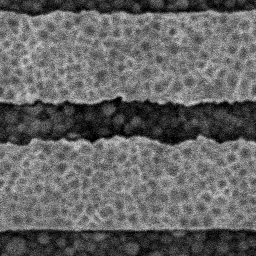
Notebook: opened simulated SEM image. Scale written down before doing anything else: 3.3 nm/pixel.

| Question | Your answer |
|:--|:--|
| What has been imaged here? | one or a few lines or trenches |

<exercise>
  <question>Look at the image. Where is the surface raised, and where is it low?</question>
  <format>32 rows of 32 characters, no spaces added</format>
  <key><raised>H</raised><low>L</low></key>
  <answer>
LLLLLLLLLLLLLLLLLLLLLLLLLLLLLLLL
LLLLLLLLLLLHLLLLLLLLLLLLLLHLLLHH
HHHHHHHHHHHHHHHHHHHHHHHHHHHHHHHH
HHHHHHHHHHHHHHHHHHHHHHHHHHHHHHHH
HHHHHHHHHHHHHHHHHHHHHHHHHHHHHHHH
HHHHHHHHHHHHHHHHHHHHHHHHHHHHHHHH
HHHHHHHHHHHHHHHHHHHHHHHHHHHHHHHH
HHHHHHHHHHHHHHHHHHHHHHHHHHHHHHHH
HHHHHHHHHHHHHHHHHHHHHHHHHHHHHHHH
HHHHHHHHHHHHHHHHHHHHHHHHHHHHHHHH
HHHHHHHHHHHHHHHHHHHHHHHHHHHHHHHH
HHHHHHHHHHHHHHHHHHHHHHHHHHHHHHHH
HHHHHHHHHHHHLLLLHHLHHHHHHHHHHHHL
LLLLLLLLLLLLLLLLLLLLLLLLLLLLLLLL
LLLLLLLLLLLLLLLLLLLLLLLLLLLLLLLL
LLLLLLLLLLLLLLLLLLLLLLLLLLLLLLLL
LLLLLLLLLLLLLLLLLLLLLLLLLLLLLLLL
LLLLHLLLLLLLLHHHHHHLLLLLHHLLLLHL
HHHHHHHHHHHHHHHHHHHHHHHHHHHHHHHH
HHHHHHHHHHHHHHHHHHHHHHHHHHHHHHHH
HHHHHHHHHHHHHHHHHHHHHHHHHHHHHHHH
HHHHHHHHHHHHHHHHHHHHHHHHHHHHHHHH
HHHHHHHHHHHHHHHHHHHHHHHHHHHHHHHH
HHHHHHHHHHHHHHHHHHHHHHHHHHHHHHHH
HHHHHHHHHHHHHHHHHHHHHHHHHHHHHHHH
HHHHHHHHHHHHHHHHHHHHHHHHHHHHHHHH
HHHHHHHHHHHHHHHHHHHHHHHHHHHHHHHH
HHHHHHHHHHHHHHHHHHHHHHHHHHHHHHHH
HHHHHHHHHHHHHHHHHHHHHHHHHHHLHHHH
LLLLLLLLLLLLLLLLLLLLLLLLLLLLLLLL
LLLLLLLLLLLLLLLLLLLLLLLLLLLLLLLL
LLLLLLLLLLLLLLLLLLLLLLLLLLLLLLLL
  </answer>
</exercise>